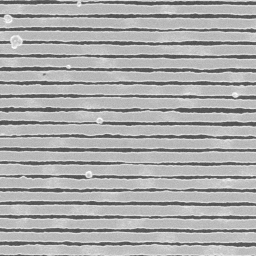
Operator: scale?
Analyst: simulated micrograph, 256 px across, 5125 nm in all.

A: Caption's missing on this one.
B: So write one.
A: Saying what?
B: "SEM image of parallel lines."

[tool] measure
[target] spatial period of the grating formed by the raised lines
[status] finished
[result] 268 nanometers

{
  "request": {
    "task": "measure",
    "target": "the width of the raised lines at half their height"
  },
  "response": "188 nm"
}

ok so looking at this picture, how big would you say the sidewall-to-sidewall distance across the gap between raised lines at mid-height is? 80.1 nm